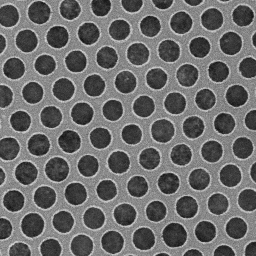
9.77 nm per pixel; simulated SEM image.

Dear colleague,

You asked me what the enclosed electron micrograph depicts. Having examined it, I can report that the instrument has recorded a regular array of holes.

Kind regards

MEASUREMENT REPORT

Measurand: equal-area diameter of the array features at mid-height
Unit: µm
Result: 0.221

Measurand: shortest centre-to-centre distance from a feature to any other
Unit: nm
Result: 296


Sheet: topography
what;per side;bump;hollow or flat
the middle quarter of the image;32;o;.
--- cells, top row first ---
o.....ooo....ooooo.oooooooooo...
o....oooooooooo.ooooo....ooo....
ooooooo.ooooo.....ooo.....oo....
.oooo....oooo.....oo......oo....
..ooo.....ooo.....oo......ooo...
...oo.....ooo.....ooo....oooo...
...oo.....ooo.....oooo..oooooooo
..oooo....ooooo.oooooooooo....oo
..oooooooooooooooo....ooo.....oo
oooo.ooooo....ooo......oo......o
oo.....ooo.....oo......oo......o
oo.....oo......oo......oo.....oo
oo.....ooo.....ooo....ooooo..ooo
oo.....ooo....oooooo.oooooooooo.
oo.....ooooooooooooooo.....ooo..
ooooooooooooooo....ooo......o...
o.ooooo....ooo.....ooo......oo..
....oo......oo......oo......oo..
....oo......oo......oo.....oooo.
....ooo.....ooo....oooo...oooooo
....ooo....ooooooooooooooooo...o
...oooooooooo.oooooo...oooo.....
oooooooooooo....ooo.....oo......
oooo....ooo.....ooo.....ooo.....
.oo......oo......oo.....ooo.....
.oo......oo.....oooo....ooooo.oo
..oo.....oo.....ooooo.oooooooooo
.ooo....ooooo.oooooooooo....ooo.
.oooooooooooooooo...oooo.....oo.
ooooooooo...oooo.....oo......oo.
o....ooo.....ooo.....oo......oo.
......oo.....ooo.....ooo....oooo